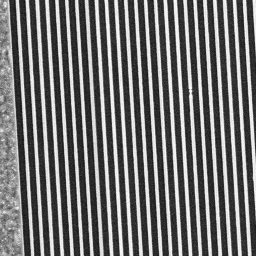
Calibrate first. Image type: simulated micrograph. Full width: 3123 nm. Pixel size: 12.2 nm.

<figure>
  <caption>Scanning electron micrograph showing parallel lines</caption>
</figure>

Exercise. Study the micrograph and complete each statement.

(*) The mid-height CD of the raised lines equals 32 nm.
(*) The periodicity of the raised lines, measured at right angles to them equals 120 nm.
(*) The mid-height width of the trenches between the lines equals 86.8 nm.